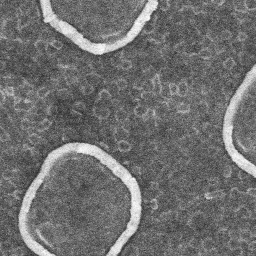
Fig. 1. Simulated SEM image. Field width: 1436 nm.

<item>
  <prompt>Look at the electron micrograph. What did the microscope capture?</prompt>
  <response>raised bodies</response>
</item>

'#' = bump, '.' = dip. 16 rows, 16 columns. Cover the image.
...#######......
...######.......
.....###........
................
................
...............#
...............#
..............##
..............##
....##........##
...####........#
..######........
..#######.......
.########.......
.#######........
..######........